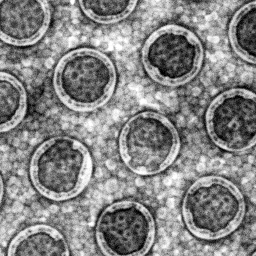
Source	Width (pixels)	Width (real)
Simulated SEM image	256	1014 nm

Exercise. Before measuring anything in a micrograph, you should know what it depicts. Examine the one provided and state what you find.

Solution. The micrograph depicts raised bodies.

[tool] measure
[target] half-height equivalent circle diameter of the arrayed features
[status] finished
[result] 245 nm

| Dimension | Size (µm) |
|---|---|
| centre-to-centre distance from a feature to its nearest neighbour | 0.36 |